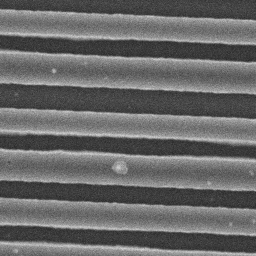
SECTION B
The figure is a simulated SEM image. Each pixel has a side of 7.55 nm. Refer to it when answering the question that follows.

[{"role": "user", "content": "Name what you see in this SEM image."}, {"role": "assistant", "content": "lines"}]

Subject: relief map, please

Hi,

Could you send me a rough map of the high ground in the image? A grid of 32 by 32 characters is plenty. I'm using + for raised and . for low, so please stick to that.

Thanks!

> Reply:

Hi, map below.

................................
+++++++.........................
+++++++++++++++++++++++++++++...
++++++++++++++++++++++++++++++++
.....+++++++++++++++++++++++++++
................................
+...............................
+++++++++++++++++++++++++.......
++++++++++++++++++++++++++++++++
++++++++++++++++++++++++++++++++
...+++++++++++++++++++++++++++++
..........................++++++
................................
................................
++++++++++++++++++++++..........
++++++++++++++++++++++++++++++++
++++++++++++++++++++++++++++++++
..........................++++++
................................
++++++++++++++++++..............
++++++++++++++++++++++++++++++++
++++++++++++++++++++++++++++++++
++++++++++++++++++++++++++++++++
........................++++++++
................................
++++++++++++++++................
++++++++++++++++++++++++++++++++
++++++++++++++++++++++++++++++++
..........++++++++++++++++++++++
................................
+++++...........................
+++++++++++++++++++++++++++.....